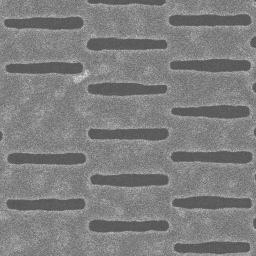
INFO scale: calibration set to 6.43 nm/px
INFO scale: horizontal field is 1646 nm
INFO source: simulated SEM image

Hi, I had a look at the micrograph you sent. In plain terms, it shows a regular array of holes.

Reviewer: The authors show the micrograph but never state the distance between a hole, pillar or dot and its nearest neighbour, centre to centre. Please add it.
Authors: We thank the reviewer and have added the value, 45.1 px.